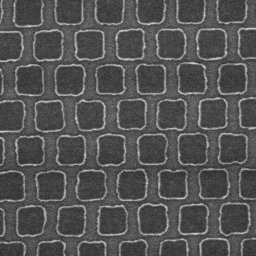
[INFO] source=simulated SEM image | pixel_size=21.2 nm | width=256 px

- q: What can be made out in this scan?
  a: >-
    a regular array of raised bodies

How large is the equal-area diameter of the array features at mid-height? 0.683 um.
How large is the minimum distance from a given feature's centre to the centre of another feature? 848 nm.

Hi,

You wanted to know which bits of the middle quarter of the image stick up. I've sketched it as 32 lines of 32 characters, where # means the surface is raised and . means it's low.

####.....#####....#######....###
#####...#######...#######....###
#####...#######...#######....###
#####...#######...#######....###
#####...#######...#######....###
#####...#######...#######....###
#####...#######...#######....###
####.......###........#.......#.
................................
....#####.....######....######..
...#######...#######....#######.
...#######...#######....#######.
...#######...#######...#######..
...#######....######...#######..
...#######...########..#######..
....######....######...#######..
....####................##......
........................#.......
#####....######....#######...###
#####...#######...########...###
#####....######...########...###
#####....######....######....###
#####...#######....######....###
#####...#######....#######...###
#####...#######....######....###
................................
.................###............
....######....######....#######.
....######...########...#######.
....######...########...#######.
...#######...########...#######.
...########..########...#######.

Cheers